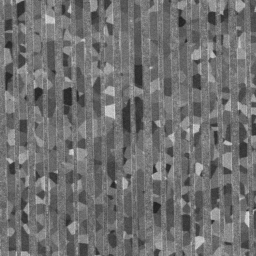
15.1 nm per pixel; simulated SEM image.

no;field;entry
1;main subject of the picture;parallel lines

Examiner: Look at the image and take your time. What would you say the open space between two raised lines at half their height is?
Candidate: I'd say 77.2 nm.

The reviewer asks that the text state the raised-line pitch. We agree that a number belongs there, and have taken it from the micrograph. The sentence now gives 14.5 pixels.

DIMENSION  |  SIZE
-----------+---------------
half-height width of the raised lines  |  128 nm